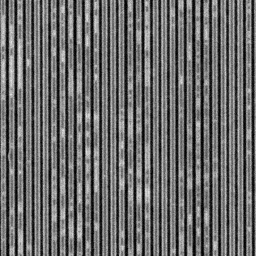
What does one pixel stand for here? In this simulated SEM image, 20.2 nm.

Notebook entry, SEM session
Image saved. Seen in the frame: parallel lines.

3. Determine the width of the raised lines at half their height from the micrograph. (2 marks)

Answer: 93.6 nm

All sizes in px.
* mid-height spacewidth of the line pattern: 3.75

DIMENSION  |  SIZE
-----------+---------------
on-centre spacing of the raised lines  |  172 nanometers